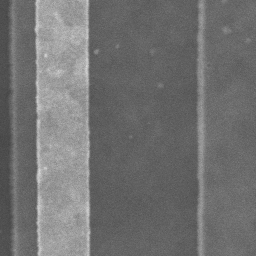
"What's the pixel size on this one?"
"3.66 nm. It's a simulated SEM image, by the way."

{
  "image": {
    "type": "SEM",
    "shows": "lines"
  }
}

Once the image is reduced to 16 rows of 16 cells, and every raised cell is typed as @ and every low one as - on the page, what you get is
-@@@@--------@@@
-@@@@--------@@@
-@@@@--------@@@
-@@@@--------@@@
-@@@@--------@@@
-@@@@--------@@@
-@@@@--------@@@
-@@@@--------@@@
-@@@@@-------@@@
-@@@@@-------@@@
-@@@@@-------@@@
-@@@@@-------@@@
-@@@@@-------@@@
-@@@@@------@@@@
-@@@@@-------@@@
-@@@@@-------@@@